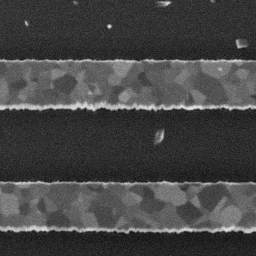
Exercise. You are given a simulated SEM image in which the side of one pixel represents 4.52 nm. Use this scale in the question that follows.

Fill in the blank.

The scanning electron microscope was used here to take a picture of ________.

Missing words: lines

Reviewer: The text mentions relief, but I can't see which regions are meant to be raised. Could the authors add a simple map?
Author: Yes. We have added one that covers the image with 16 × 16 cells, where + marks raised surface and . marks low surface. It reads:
................
................
................
................
++++++++++++++++
++++++++++++++++
++++++++++++++++
................
................
................
................
++++++++++++++++
++++++++++++++++
++++++++++++++++
................
................